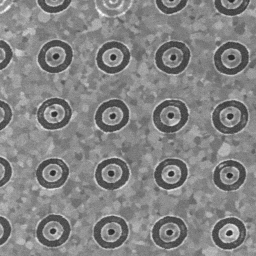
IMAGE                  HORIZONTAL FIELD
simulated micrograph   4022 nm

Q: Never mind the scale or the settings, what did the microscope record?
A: a regular array of ring-shaped grooves with a dot in the middle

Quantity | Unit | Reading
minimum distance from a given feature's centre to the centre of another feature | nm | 909